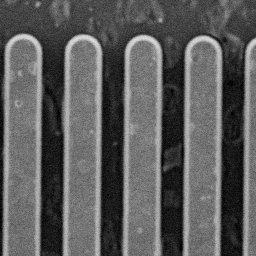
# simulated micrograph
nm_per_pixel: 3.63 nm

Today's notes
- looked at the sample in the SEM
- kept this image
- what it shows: groups of lines, slits or small figures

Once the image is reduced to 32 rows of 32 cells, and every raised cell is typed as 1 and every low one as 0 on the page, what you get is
00000000000000000000000000000000
00000000000000000000000000000000
00000000000000000000000000000000
00000000000000000000000000000000
00000000000000000000000000000000
01111000011100001111000011100000
01111000111100001111000111100001
01111000111100001111000111100001
01111000111100001111000111100001
01111000111100001111000111100001
01111000111100001111000111100001
01111000111100001111000111100001
01111000111100001111000111100001
01111000111100001111000111100001
01111000111100001111000111100001
01111000111100001111000111100001
01111000111100001111000111100001
01111000111100001111000111100001
01111000111100001111000111100001
01111000111100001111000111100001
01111000111100001111000111100001
01111000111100001111000111100001
01111000111100001111000111100001
01111000111100001111000111100001
01111000111100001111000111100001
01111000111100001111000111100001
01111000111100001111000111100001
01111000111100001111000111100001
01111000111100001111000111100001
01111000111100001111000111100001
01111000111100001111000111100001
01111000111100001111000111100001